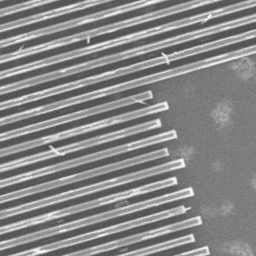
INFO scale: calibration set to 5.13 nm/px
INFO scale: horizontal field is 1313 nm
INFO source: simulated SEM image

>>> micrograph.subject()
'parallel lines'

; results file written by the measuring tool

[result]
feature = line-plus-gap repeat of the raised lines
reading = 76.7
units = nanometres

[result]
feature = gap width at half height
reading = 0.0389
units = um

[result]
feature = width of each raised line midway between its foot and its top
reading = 0.0383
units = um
